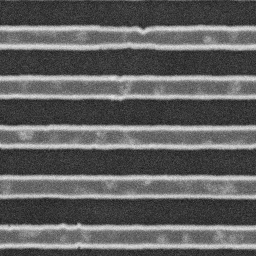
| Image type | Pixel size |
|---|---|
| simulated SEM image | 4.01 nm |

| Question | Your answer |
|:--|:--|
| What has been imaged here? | parallel lines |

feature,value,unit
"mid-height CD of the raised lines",79.7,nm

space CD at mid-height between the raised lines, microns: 0.12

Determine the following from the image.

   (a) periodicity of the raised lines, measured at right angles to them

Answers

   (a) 200 nanometres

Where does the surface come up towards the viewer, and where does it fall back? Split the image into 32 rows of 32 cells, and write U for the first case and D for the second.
DDDDDDDDDDDDDDDDDDDDDDDDDDDDDDDD
DDDDDDDDDDDDDDDDDDDDDDDDDDDDDDDD
DDDDDDDDDDDDDDDDDDDDDDDDDDDDDDDD
DDDDDDDDDDDDDDDDDDDDDDDDUUDUDDDD
UUUUUUUUUUUUUUUUUUUUUUUUUUUUUUUU
UUUUUUUUUUUUUUUUUUUUUUUUUUUUUUUU
DDDDDDDDDDDDDDDDDDDDDDDDDDDDDDDD
DDDDDDDDDDDDDDDDDDDDDDDDDDDDDDDD
DDDDDDDDDDDDDDDDDDDDDDDDDDDDDDDD
DDDDDDDDDDDDDDDDDDDDDDDDDDDDDDDD
UUUUUUUUUUUUUUUUUUUUUUUUUUUUUUUU
UUUUUUUUUUUUUUUUUUUUUUUUUUUUUUUU
DDDDDDDDDDDDDDDDDDDDDDDDDDDDDDDD
DDDDDDDDDDDDDDDDDDDDDDDDDDDDDDDD
DDDDDDDDDDDDDDDDDDDDDDDDDDDDDDDD
DDDDDDDDDDDDDDDDDDDDDDDDDDDDDDDD
UUUUUUUUUUUUUUUUUUUUUUUUUUUUUUUU
UUUUUUUUUUUUUUUUUUUUUUUUUUUUUUUU
DDDDDDDDDDDDDDDDDDDDDDDDDDDDDDDD
DDDDDDDDDDDDDDDDDDDDDDDDDDDDDDDD
DDDDDDDDDDDDDDDDDDDDDDDDDDDDDDDD
DDDDDDDDDDDDDDDDDDDDDDDDDDDDDDDD
UUUUUUUUUUUUUUUUUUUUUUUUUUUUUUUU
UUUUUUUUUUUUUUUUUUUUUUUUUUUUUUUU
UUUUUDDUUUUUUUUUUUUUUUUUUUUUUUUU
DDDDDDDDDDDDDDDDDDDDDDDDDDDDDDDD
DDDDDDDDDDDDDDDDDDDDDDDDDDDDDDDD
DDDDDDDDDDDDDDDDDDDDDDDDDDDDDDDD
UUUUUUUUUUUUUUUUUUUUUUUUUUUUUUUU
UUUUUUUUUUUUUUUUUUUUUUUUUUUUUUUU
UUUUUUUUUUUUUUUUUUUUUUUUUUUUUUUU
DDDDDDDDDDDDDDDDDDDDDDDDDDDDDDDD